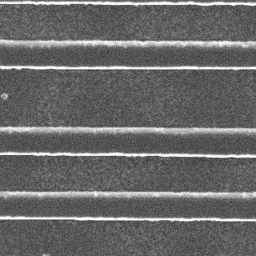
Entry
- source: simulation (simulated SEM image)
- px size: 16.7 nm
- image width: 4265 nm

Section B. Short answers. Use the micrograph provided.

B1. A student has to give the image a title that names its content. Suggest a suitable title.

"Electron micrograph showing lines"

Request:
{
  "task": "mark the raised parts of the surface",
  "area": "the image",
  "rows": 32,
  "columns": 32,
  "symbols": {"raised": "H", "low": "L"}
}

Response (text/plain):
LLLLLLLLLLLLLLLLLLLLLLLLLHHLLHLH
LLLLLLLLLLLLLLLLLLLLLLLLLLLLLLLL
LLLLLLLLLLLLLLLLLLLLLLLLLLLLLLLL
LLLLLLLLLLLLLLLLLLLLLLLLLLLLLLLL
LLLLLLLLLLLLLLLLLLLLLLLLLLLLLLLL
HHHHHHHHHHHHHHHHHHHHHHHHHHHHHLLL
HHHHHHHHHHHHHHHHHHHHHHHHHHHHHHHH
HHHHHHHHHHHHHHHHHHHHHHHHHHHHHHHH
LLLHHHHHHHHHHHHHHHHHHHHHHHHHHHHH
LLLLLLLLLLLLLLLLLLLLLLLLLLLLLLLL
LLLLLLLLLLLLLLLLLLLLLLLLLLLLLLLL
LLLLLLLLLLLLLLLLLLLLLLLLLLLLLLLL
LLLLLLLLLLLLLLLLLLLLLLLLLLLLLLLL
LLLLLLLLLLLLLLLLLLLLLLLLLLLLLLLL
LLLLLLLLLLLLLLLLLLLLLLLLLLLLLLLL
LLLLLLLLLLLLLLLLLLLLLLLLLLLLLLLL
HHHHHHHHHHHHHHHHHHHHHHHHHHHHHHHH
HHHHHHHHHHHHHHHHHHHHHHHHHHHHHHHH
HHHHHHHHHHHHHHHHHHHHHHHHHHHHHHHH
LLLLLLLLLLLLLLLLLLLLLLLLLLHHHHHH
LLLLLLLLLLLLLLLLLLLLLLLLLLLLLLLL
LLLLLLLLLLLLLLLLLLLLLLLLLLLLLLLL
LLLLLLLLLLLLLLLLLLLLLLLLLLLLLLLL
LLLLLLLLLLLLLLLLLLLLLLLLLLLLLLLL
HHHHHHHHHHHHHHHHHHHHHHHHHHHHHHHH
HHHHHHHHHHHHHHHHHHHHHHHHHHHHHHHH
HHHHHHHHHHHHHHHHHHHHHHHHHHHHHHHH
LLLLLLLLLLLLLLLLLLLLLLHHHLLHHHHH
LLLLLLLLLLLLLLLLLLLLLLLLLLLLLLLL
LLLLLLLLLLLLLLLLLLLLLLLLLLLLLLLL
LLLLLLLLLLLLLLLLLLLLLLLLLLLLLLLL
LLLLLLLLLLLLLLLLLLLLLLLLLLLLLLLL